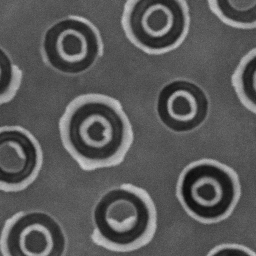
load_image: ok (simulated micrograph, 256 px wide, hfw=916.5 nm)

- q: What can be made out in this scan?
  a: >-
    ring-shaped grooves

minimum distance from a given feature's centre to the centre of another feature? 317 nm